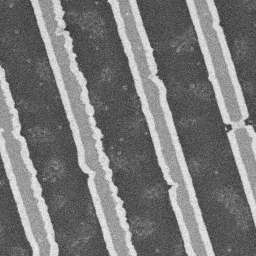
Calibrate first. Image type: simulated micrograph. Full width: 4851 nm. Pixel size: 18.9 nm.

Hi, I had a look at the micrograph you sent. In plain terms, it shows one or a few lines or trenches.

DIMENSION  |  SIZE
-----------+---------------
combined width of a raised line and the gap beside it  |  1400 nm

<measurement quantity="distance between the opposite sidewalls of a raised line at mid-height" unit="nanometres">358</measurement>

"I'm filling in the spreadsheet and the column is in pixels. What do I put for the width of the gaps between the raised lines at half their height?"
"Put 55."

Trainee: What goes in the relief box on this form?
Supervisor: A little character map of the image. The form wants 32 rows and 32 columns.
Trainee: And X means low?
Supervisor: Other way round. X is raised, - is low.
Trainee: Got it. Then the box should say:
----XXX-------XXX-------XX------
-----XX--------XX-------XXX-----
-----XX--------XX--------XX-----
-----XXX-------XXX-------XX-----
------XXX------XXX-------XXX----
------XXX-------XX-------XXX----
------XXX-------XXX-------XX----
-------XX-------XXX-------XXX---
-------XX--------XX-------XXX---
-------XXX-------XX--------XX---
X-------XX-------XXX-------XX---
X-------XXX-------XX-------XXX--
X-------XXX-------XX--------XX--
XX-------XX-------XXX-------XX--
XX-------XX--------XX-------XXX-
XX-------XXX-------XX--------X--
XX--------XX-------XXX-------XX-
XXX-------XX--------XX-------XXX
XXX-------XX--------XX-------XXX
-XX-------XXX-------XX--------XX
-XXX------XXX-------XXX-------XX
-XXX-------XX--------XX-------XX
--XX-------XXX-------XX--------X
--XXX-------XX--------XX-------X
--XXX-------XX--------XX-------X
---XX-------XXX-------XX--------
---XX-------XXX-------XXX-------
---XXX-------XX--------XX-------
---XXX-------XXX-------XX-------
----XX-------XXX-------XXX------
----XXX-------XX--------XX------
-----XX-------XXX-------XX------